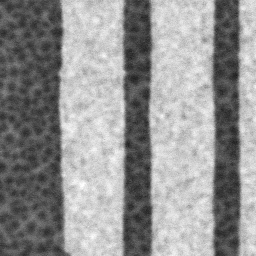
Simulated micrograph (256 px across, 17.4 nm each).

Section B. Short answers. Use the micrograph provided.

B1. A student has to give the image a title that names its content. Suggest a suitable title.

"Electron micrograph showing one or a few lines or trenches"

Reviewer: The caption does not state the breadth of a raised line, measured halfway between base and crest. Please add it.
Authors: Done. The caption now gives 1020 nanometres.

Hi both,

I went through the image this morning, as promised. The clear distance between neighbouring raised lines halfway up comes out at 0.517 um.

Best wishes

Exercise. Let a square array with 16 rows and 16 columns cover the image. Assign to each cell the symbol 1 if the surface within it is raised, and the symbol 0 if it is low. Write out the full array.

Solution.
0000111100111001
0000111100111001
0000111100111001
0000111100111001
0000111100111001
0000111100111001
0000111101111001
0000111101111001
0000111101111001
0000111100111001
0000111100111001
0000111100111001
0000111100111001
0000111100111001
0000111100111001
0000111100111001